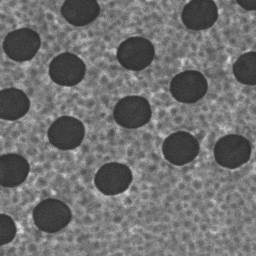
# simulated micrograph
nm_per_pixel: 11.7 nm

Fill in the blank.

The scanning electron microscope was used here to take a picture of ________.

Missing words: a regular array of holes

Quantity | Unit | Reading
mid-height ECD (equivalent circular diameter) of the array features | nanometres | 432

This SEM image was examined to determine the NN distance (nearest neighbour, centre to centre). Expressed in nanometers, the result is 688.